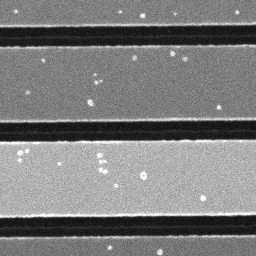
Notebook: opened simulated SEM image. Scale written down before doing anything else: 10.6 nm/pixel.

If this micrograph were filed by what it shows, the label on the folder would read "lines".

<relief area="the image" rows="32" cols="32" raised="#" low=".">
################################
################################
################################
................................
................................
................................
################################
################################
################################
################################
################################
################################
################################
################################
################################
................................
................................
................................
################################
################################
################################
################################
################################
################################
################################
################################
################################
................................
................................
.....................###########
################################
################################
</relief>